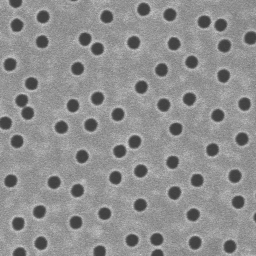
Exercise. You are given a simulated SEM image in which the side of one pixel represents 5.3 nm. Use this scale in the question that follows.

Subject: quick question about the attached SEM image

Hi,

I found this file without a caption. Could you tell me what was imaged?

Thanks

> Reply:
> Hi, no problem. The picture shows a regular array of holes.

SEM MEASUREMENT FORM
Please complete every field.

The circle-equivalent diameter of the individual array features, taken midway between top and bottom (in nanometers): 67.6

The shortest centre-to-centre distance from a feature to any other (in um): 0.139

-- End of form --